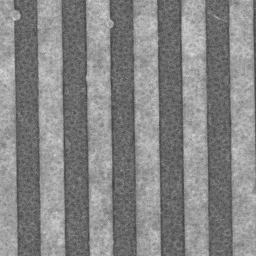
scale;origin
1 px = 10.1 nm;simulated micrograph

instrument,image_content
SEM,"parallel lines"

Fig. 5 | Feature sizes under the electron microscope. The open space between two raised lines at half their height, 240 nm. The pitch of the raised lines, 47.6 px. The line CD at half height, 0.24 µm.